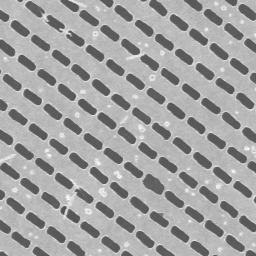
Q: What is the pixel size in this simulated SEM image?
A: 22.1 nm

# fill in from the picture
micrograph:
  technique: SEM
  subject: a regular array of holes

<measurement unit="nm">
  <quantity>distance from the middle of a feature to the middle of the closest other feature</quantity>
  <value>534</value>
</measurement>